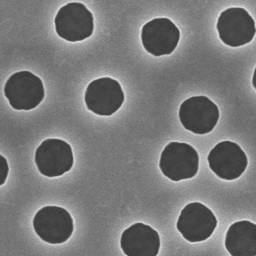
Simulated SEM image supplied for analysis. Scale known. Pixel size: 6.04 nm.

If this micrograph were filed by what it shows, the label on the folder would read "a regular array of holes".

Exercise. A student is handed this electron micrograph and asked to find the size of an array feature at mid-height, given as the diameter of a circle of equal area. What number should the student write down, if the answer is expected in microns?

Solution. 0.233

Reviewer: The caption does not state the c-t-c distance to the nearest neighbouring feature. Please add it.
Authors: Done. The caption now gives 0.403 µm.